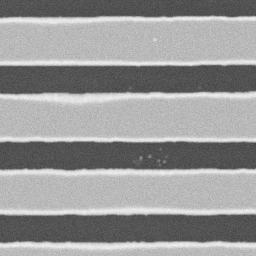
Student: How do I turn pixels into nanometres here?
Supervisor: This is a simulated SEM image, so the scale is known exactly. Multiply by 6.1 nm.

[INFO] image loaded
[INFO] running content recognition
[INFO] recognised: lines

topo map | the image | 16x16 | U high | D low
DDDDDDDDDDDDDDDD
UUUUUUUUUUUUUUUU
UUUUUUUUUUUUUUUU
UUUUUUUUUUUUUUUU
DDDDDDDDDDDDDDDD
DDDDDDDDDDDDDDDD
UUUUUUUUUUUUUUUU
UUUUUUUUUUUUUUUU
UUUUUUUUUUUUUUUU
DDDDDDDDDDDDDDDD
DDDDDDDDDDDDDDDD
UUUUUUUUUUUUUUUU
UUUUUUUUUUUUUUUU
DDDDDDDDDDDDDDDD
DDDDDDDDDDDDDDDD
UUUUUUUUUUUUUUUU